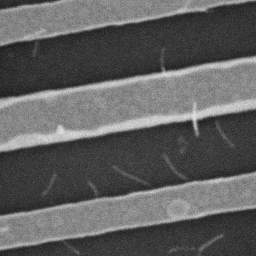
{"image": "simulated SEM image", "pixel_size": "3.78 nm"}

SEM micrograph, lines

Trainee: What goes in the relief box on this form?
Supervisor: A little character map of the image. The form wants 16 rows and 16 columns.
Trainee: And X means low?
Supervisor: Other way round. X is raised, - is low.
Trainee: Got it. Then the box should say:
-XXXXXXXXXXXX---
XXXXXXXX--------
XX--------------
----------------
-----------XXXXX
-----XXXXXXXXXXX
XXXXXXXXXXXXXXXX
XXXXXXXXXXX-----
XXXXX-----------
----------------
----------------
------------XXXX
------XXXXXXXXXX
XXXXXXXXXXXXX---
XXXXXXX---------
X---------------